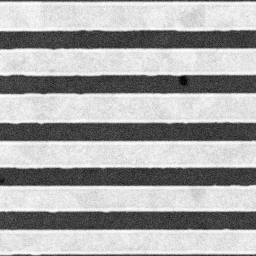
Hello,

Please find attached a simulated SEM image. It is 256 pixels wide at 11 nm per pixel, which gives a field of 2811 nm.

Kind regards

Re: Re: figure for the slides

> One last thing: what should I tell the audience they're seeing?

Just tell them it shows lines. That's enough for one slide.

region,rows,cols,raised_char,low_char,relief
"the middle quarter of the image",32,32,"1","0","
11111111111111111111111111111111
11111111111111111111111111111111
11111111111111111111111111111111
00000000000000000000000000000000
00000000000000000000000000000000
00000000000000000000000000000000
00000000000000000000000000000000
00000000000000000000000000000000
11111111111111111111111111111111
11111111111111111111111111111111
11111111111111111111111111111111
11111111111111111111111111111111
11111111111111111111111111111111
11111111111111111111111111111111
11111111111111111111111111111111
00000000000000000000000000000000
00000000000000000000000000000000
00000000000000000000000000000000
00000000000000000000000000000000
11111110011111110111111111111111
11111111111111111111111111111111
11111111111111111111111111111111
11111111111111111111111111111111
11111111111111111111111111111111
11111111111111111111111111111111
11111111111111111111111111111111
00000000000000000000000000000000
00000000000000000000000000000000
00000000000000000000000000000000
00000000000000000000000000000000
00000000000000000000000000000000
11111111111111111111111111111111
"